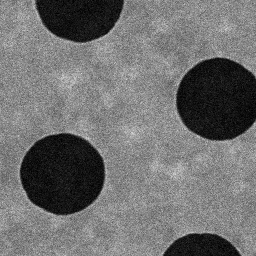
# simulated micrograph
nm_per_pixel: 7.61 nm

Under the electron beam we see holes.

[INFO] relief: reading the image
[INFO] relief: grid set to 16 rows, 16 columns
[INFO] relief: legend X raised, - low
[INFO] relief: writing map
XX------XXXXXXXX
XXX----XXXXXXXXX
XXXX--XXXXXXXXXX
XXXXXXXXXXXXXXXX
XXXXXXXXXXXX----
XXXXXXXXXXX-----
XXXXXXXXXXX-----
XXXXXXXXXXX-----
XXX--XXXXXXX---X
XX----XXXXXXXXXX
X------XXXXXXXXX
X-----XXXXXXXXXX
XX----XXXXXXXXXX
XXXXXXXXXXXXXXXX
XXXXXXXXXXXXXXXX
XXXXXXXXXX-----X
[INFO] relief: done